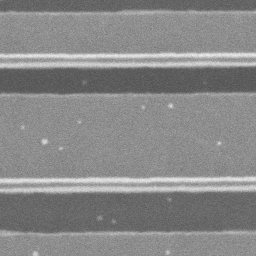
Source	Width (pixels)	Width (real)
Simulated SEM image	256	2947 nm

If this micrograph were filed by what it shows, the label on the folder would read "lines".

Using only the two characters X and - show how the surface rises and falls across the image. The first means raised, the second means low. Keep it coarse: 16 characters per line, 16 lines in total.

----------------
XXXXXXXXXXXXXXXX
XXXXXXXXXXXXXXXX
XXXXXXXXXXXXXXXX
----------------
----------------
XXXXXXXXXXXXXXXX
XXXXXXXXXXXXXXXX
XXXXXXXXXXXXXXXX
XXXXXXXXXXXXXXXX
XXXXXXXXXXXXXXXX
XXXXXXXXXXXXXXXX
----------------
----------------
----------------
XXXXXXXXXXXXXXXX